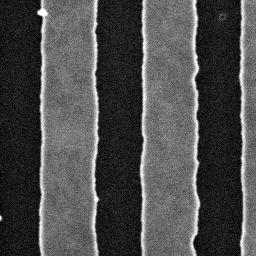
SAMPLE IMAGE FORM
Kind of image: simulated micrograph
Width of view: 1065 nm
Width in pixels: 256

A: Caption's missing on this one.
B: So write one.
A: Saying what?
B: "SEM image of lines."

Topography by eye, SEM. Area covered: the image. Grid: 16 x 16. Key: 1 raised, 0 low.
0001110001110001
0001110001110001
0001110001110001
0001110001110001
0001110001110001
0001110001110001
0001110001110001
0001110001110001
0001110001110001
0001110001110001
0001110001110001
0001110001110001
0001110001110001
0011110001110001
0011110001110001
0011110001110001